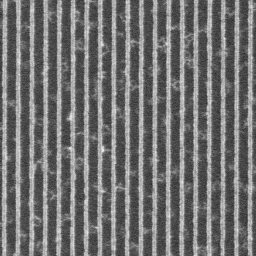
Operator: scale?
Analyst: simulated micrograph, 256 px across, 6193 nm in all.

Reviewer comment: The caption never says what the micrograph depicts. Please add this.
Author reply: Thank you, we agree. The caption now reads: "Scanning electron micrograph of parallel lines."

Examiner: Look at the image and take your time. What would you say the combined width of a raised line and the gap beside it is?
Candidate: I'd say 0.33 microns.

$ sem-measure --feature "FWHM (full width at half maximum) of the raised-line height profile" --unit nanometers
69.6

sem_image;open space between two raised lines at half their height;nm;257